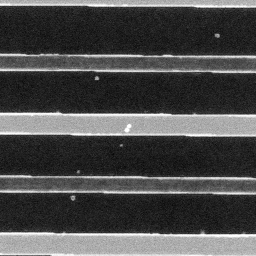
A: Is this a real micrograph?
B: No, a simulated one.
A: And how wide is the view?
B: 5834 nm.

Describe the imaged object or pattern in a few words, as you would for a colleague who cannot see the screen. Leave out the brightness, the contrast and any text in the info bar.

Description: lines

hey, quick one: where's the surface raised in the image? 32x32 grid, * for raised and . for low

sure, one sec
********************************
................................
................................
................................
................................
................................
................................
********************************
********************************
................................
................................
................................
................................
................................
********************************
********************************
********************************
................................
................................
................................
................................
................................
********************************
********************************
................................
................................
................................
................................
................................
*****************************...
********************************
********************************